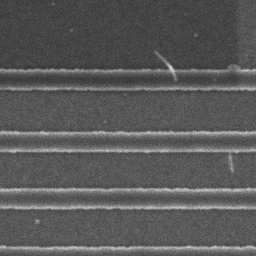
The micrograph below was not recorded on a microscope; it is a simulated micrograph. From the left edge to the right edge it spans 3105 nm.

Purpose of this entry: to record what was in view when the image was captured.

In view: lines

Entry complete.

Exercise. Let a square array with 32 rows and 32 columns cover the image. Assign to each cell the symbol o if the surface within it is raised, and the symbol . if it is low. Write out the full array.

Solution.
................................
................................
................................
................................
................................
................................
................................
................................
.....................o.......o..
oooooooooooooooooooooooooooooooo
oooooooooooooooooooooooooooooooo
................................
................................
................................
................................
................................
ooo..o.....ooo.o..oooo..oooooooo
oooooooooooooooooooooooooooooooo
oooooooooooooooooooooooooooooooo
................................
................................
................................
................................
................................
oooooooooooooooooooooooooooooooo
oooooooooooooooooooooooooooooooo
................................
................................
................................
................................
................................
oooooooooooooooooooooooooooooooo